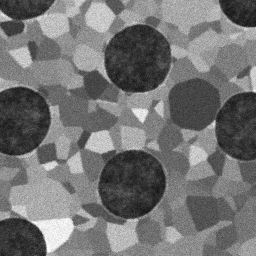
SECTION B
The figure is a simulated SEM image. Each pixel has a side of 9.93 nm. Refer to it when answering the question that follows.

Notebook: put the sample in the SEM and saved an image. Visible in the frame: holes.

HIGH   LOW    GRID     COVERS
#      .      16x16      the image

...###########..
###############.
#######...######
#######....#####
#######....#####
#.#####...######
...###########..
...##########...
...##########...
..######.#####..
######....######
######....######
######....######
#######..#######
...#############
...#############